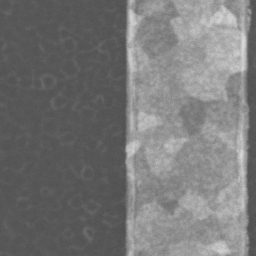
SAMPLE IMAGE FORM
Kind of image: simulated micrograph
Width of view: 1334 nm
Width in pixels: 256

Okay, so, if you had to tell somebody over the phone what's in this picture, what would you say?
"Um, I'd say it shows one or a few lines or trenches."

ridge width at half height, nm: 587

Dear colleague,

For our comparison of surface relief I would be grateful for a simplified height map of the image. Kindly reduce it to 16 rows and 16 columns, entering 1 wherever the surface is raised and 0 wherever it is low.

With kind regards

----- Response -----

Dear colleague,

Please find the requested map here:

0000000011111110
0000000011111110
0000000011111110
0000000011111110
0000000011111110
0000000011111110
0000000011111110
0000000011111110
0000000011111110
0000000011111110
0000000011111110
0000000011111110
0000000011111110
0000000011111110
0000000011111110
0000000011111110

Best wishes